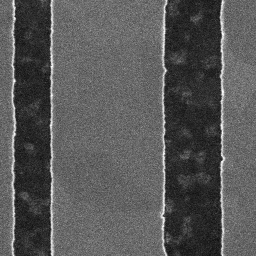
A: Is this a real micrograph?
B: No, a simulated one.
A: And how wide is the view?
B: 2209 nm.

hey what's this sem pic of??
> one or a few lines or trenches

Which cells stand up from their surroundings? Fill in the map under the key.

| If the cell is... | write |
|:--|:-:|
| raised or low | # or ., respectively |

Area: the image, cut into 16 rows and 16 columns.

#..#######....##
#..#######....##
#..#######....##
#..#######....##
#..#######....##
#..#######....##
#..#######....##
#..#######....##
#..#######....##
#..#######....##
#..#######....##
#..#######....##
#..#######....##
#..#######....##
#..#######....##
#..#######....##